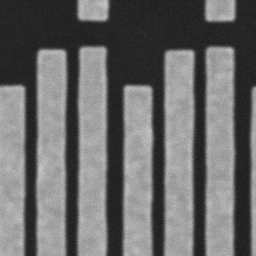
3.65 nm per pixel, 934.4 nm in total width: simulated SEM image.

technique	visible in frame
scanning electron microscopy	wiring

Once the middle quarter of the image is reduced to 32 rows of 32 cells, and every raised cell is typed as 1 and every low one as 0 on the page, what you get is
00001111110000000000000001111111
00001111110000000000000001111111
00001111110000000000000001111111
00001111110000000000000001111111
00001111110000000000000001111111
00001111110000000000000001111111
00001111110000011111110001111111
00001111110000011111110001111111
00001111110000011111110001111111
00001111110000011111110001111111
00001111110000011111110001111111
00001111110000011111110001111111
00001111110000011111110001111111
00001111110000011111110001111111
00001111110000011111110001111111
00001111110000011111110001111111
00001111110000011111110001111111
00001111110000011111110001111111
00001111110000011111110001111111
00001111110000011111110001111111
00001111110000011111110001111111
00001111110000011111110001111111
00001111110000011111110001111111
00001111110000011111110001111111
00001111110000011111110001111111
00001111110000011111110001111111
00001111110000011111110001111111
00001111110000011111110001111111
00001111110000011111110001111111
00001111110000011111110001111111
00001111110000011111110001111111
00001111110000011111110001111111